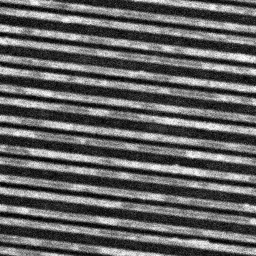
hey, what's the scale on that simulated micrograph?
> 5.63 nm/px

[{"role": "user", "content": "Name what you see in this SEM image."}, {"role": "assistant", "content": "parallel lines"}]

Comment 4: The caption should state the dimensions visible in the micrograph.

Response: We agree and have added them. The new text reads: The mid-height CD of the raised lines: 0.0286 µm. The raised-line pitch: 83.5 nanometers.